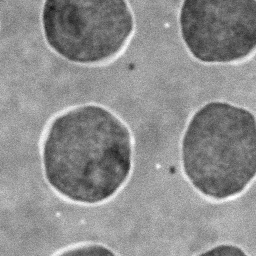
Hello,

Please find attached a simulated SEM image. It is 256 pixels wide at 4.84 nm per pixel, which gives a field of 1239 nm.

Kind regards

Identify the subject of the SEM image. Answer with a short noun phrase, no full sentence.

holes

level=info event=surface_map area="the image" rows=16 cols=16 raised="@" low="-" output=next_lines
@@@-----@@@-----
@@@-----@@@-----
@@@-----@@@@----
@@@@---@@@@@---@
@@@@@@@@@@@@@@@@
@@@@@@@@@@@@@@@@
@@@@@@@@@@@@@-@@
@@@----@@@@@----
@@@-----@@@@----
@@@-----@@@-----
@@@-----@@@-----
@@@-----@@@@----
@@@@@-@@@@@@@@@@
@@@@@@@@@@@@@@@@
@@@@@@@@@@@@@@@@
@@@@@--@@@@@@--@